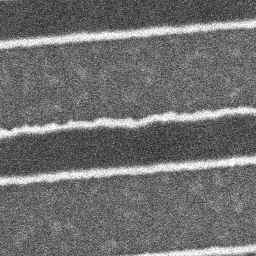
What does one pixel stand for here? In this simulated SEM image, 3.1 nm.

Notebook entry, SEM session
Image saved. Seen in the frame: one or a few lines or trenches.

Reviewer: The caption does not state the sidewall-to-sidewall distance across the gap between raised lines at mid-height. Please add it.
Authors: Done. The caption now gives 266 nm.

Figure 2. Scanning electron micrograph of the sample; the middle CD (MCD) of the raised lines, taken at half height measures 0.158 µm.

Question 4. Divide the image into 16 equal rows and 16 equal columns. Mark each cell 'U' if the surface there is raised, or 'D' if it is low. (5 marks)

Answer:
UUUUUUUUUUUUUUUU
UUUUUUUUUUUUUUUU
UUUUDDDDDDDDDDDD
DDDDDDDDDDDDDDDD
DDDDDDDDDDDDDDDD
DDDDDDDDDDDDDDDD
DDDDDDDDDDDDDDDD
DDDDDDDDDUUUUUUU
UUUUUUUUUUUUUUUU
UUUUUUUUUUUUUUUU
UUUUUUUUUUDDDDDD
DDDDDDDDDDDDDDDD
DDDDDDDDDDDDDDDD
DDDDDDDDDDDDDDDD
DDDDDDDDDDDDDDDD
DDDDDDDDDDDDDDDD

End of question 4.